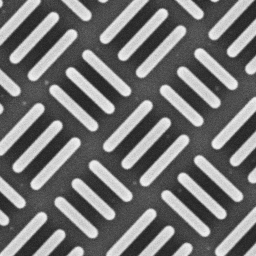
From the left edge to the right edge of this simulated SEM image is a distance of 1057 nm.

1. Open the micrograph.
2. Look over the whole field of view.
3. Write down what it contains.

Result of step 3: groups of lines, slits or small figures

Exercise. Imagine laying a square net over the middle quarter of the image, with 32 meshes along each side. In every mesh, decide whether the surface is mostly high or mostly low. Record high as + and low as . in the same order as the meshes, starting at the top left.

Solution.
.......++++........++++.........
.++.....+++.......++++.......++.
.+++.....++++.....+++........+++
.++++.....++++...............+++
..++++.....++++...............++
....+++.....++++................
.....+++.....++++.......+++.....
......+++.....++........++++....
+......+++...............++++...
+++.....+++.........++.....+++..
++++.....+++.......+++......++++
.++++.....++......++++.......+++
..++++...........++++........+++
...++++.........++++...........+
....++++.......++++.....++......
.....+++......++++.....+++......
.......+.....++++.....++++......
............++++.....++++.......
...........++++.....++++.....++.
.+++.......+++.....++++.....+++.
++++......+++.....++++.....+++..
+++.......++.....++++.....+++...
++..............++++.....++++...
+..............++++.....+++.....
.......++......+++.....++++.....
......++++.....++.....++++......
.......++++..........++++.......
........++++........++++.....++.
.........++++......++++......+++
..+++.....++++.....+++.......+++
..++++.....++++...............++
...++++.....++++...............+